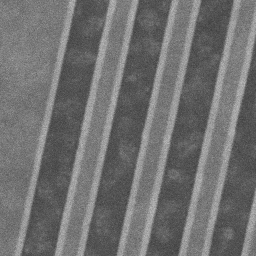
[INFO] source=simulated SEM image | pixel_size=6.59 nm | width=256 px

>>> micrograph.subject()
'one or a few lines or trenches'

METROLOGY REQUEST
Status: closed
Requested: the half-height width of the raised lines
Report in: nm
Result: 155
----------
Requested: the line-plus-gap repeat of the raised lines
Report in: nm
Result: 401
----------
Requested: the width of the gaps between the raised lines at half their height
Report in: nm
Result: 250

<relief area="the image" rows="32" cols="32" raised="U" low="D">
UUUUUUUUUDDDDDUUUDDDDDUUUDDDDUUU
UUUUUUUUUDDDDDUUUDDDDDUUDDDDDUUU
UUUUUUUUUDDDDUUUDDDDDUUUDDDDDUUU
UUUUUUUUDDDDDUUUDDDDDUUUDDDDDUUU
UUUUUUUUDDDDDUUUDDDDDUUUDDDDDUUU
UUUUUUUUDDDDDUUUDDDDDUUUDDDDUUUD
UUUUUUUUDDDDDUUUDDDDUUUDDDDDUUUD
UUUUUUUUDDDDUUUDDDDDUUUDDDDDUUUD
UUUUUUUDDDDDUUUDDDDDUUUDDDDDUUUD
UUUUUUUDDDDDUUUDDDDDUUUDDDDDUUUD
UUUUUUUDDDDDUUUDDDDDUUUDDDDUUUDD
UUUUUUUDDDDDUUDDDDDUUUDDDDDUUUDD
UUUUUUDDDDDUUUDDDDDUUUDDDDDUUUDD
UUUUUUDDDDDUUUDDDDDUUUDDDDDUUUDD
UUUUUUDDDDDUUUDDDDDUUUDDDDUUUDDD
UUUUUUDDDDDUUUDDDDUUUDDDDDUUUDDD
UUUUUUDDDDUUUDDDDDUUUDDDDDUUUDDD
UUUUUDDDDDUUUDDDDDUUUDDDDDUUUDDD
UUUUUDDDDDUUUDDDDDUUUDDDDDUUUDDD
UUUUUDDDDDUUUDDDDDUUUDDDDUUUDDDD
UUUUUDDDDDUUUDDDDUUUDDDDDUUUDDDD
UUUUDDDDDUUUDDDDDUUUDDDDDUUUDDDD
UUUUDDDDDUUUDDDDDUUUDDDDDUUUDDDD
UUUUDDDDDUUUDDDDDUUUDDDDUUUUDDDD
UUUUDDDDDUUUDDDDDUUUDDDDUUUDDDDD
UUUUDDDDUUUDDDDDUUUDDDDDUUUDDDDD
UUUDDDDDUUUDDDDDUUUDDDDDUUUDDDDD
UUUDDDDDUUUDDDDDUUUDDDDDUUUDDDDU
UUUDDDDDUUUDDDDDUUUDDDDUUUDDDDDU
UUUDDDDDUUUDDDDUUUDDDDDUUUDDDDDU
UUUDDDDUUUDDDDDUUUDDDDDUUUDDDDDU
UUDDDDDUUUDDDDDUUUDDDDDUUUDDDDDU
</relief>